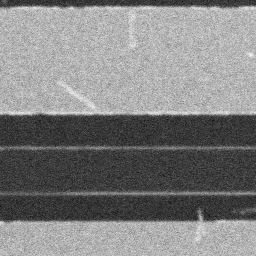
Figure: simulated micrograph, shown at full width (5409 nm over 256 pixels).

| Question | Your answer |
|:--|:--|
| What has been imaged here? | lines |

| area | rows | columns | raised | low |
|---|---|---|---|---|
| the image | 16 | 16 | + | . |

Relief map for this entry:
++++++++++++++.+
++++++++++++++++
++++++++++++++++
++++++++++++++++
++++++++++++++++
++++++++++++++++
++++++++++++++++
................
................
++++++++++++++++
++++++++++++++++
++++++++++++++++
................
................
++++++++++++++++
++++++++++++++++